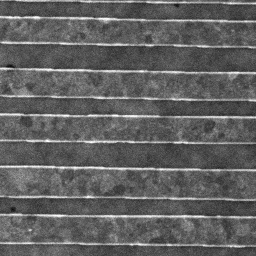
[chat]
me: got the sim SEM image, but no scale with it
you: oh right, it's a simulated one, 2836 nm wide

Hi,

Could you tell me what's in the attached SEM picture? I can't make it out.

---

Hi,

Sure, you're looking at lines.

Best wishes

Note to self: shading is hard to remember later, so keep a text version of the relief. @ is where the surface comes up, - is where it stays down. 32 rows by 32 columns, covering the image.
--------------------------------
--------------------------------
@@@@@@@@@@@@@@@@@@--------------
@@@@@@@@@@@@@@@@@@@@@@@@@@@@@@@@
@@@@@@@@@@@@@@@@@@@@@@@@@@@@@@@@
------------@@@@@@@@@@@@@@@@@@@@
--------------------------------
--------------------------------
--------------------------------
@@@@@@@@@@@@@@@@@@@@@@@@@@@@@@@@
@@@@@@@@@@@@@@@@@@@@@@@@@@@@@@@@
@@@@@@@@@@@@@@@@@@@@@@@@@@@@@@@@
-------------------------------@
--------------------------------
@@@@@@@@------------------------
@@@@@@@@@@@@@@@@@@@@@@@@@@@@@@@@
@@@@@@@@@@@@@@@@@@@@@@@@@@@@@@@@
@@@@@@@@@@@@@@@@@@@@@@@@@@@@@@@@
--------------------------------
--------------------------------
--------------------------------
@@@@@@@@@@@@@@@@@@@@@@@@@@@@@@@@
@@@@@@@@@@@@@@@@@@@@@@@@@@@@@@@@
@@@@@@@@@@@@@@@@@@@@@@@@@@@@@@@@
@@@@@@@@@@@@@@@@@@@@@@@@@@@@@@@@
--------------------------------
--------------------------------
@@@@@@@@@@@@@@@@@@@@@@@@@@@@@@@@
@@@@@@@@@@@@@@@@@@@@@@@@@@@@@@@@
@@@@@@@@@@@@@@@@@@@@@@@@@@@@@@@@
----------@@@@@@@@@@@@@@@@@@@@@@
--------------------------------